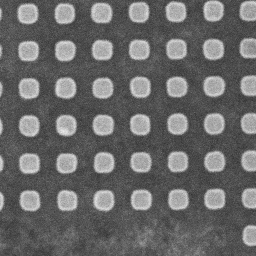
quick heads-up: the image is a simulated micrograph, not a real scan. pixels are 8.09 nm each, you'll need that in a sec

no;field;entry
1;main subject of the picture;a regular array of raised bodies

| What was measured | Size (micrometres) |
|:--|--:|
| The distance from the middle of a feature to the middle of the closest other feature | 0.298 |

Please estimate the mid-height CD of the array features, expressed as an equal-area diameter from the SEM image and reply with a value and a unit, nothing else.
164 nm